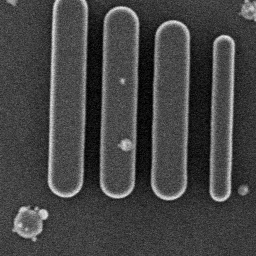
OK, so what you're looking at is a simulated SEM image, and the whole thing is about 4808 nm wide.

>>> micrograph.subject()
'groups of lines, slits or small figures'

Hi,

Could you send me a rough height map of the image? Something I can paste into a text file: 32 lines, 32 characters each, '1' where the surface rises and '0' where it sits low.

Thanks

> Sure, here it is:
00000001111000000000000000000000
00000001111000111000000000000000
00000001111001111000000000000000
00000001111001111000111000000000
00000001111001111001111100000000
00000001111001111001111100011000
00000001111001111001111100011000
00000011111001111001111100011000
00000011111001111001111100011000
00000011111001111001111100011000
00000011111001111001111100011000
00000011111001111001111000011000
00000011111001111001111000011000
00000011111001111001111000111000
00000011111001111001111000111000
00000011111001111001111000111000
00000011110001111001111000111000
00000011110001111001111000111000
00000011110001111001111000111000
00000011110001111001111000111000
00000011110001111001111000111000
00000011110001111001111000111000
00000011110001111001111000111000
00000011110001111001111000111000
00000000100000110000110000111000
00000000000000000000000000000000
00000000000000000000000000000000
00000000000000000000000000000000
00000000000000000000000000000000
00000000000000000000000000000000
00000000000000000000000000000000
00000000000000000000000000000000